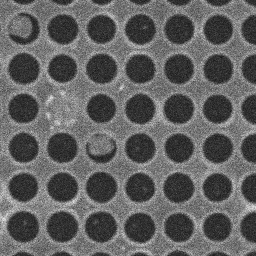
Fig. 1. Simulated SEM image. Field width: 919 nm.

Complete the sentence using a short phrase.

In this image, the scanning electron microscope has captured a regular array of holes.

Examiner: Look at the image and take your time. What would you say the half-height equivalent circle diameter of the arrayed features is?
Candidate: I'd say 0.111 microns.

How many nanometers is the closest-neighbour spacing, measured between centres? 139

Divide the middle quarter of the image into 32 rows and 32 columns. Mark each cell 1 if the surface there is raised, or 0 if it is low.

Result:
00011000000001100000000110000000
00011000000001100000000110000000
00011100000001110000000110000000
00011100000001110000001110000000
01111110000011111000011111000001
11111111111111111111111111111111
11111111111111111111111111111111
11111111001111111100111111100111
11111110000011110000001111000001
11111100000001110000001110000000
11111100000001100000000110000000
11111000000001100000000110000000
11111100000001100000000110000000
11111100000011110000001110000000
11111110000111111000011111000001
11111111111111111111111111111111
11111111111111111111111111111111
01111111001111111100111111110011
00011100011011110000001111000001
00011101111001100000000110000000
00001001111101100000000110000000
00001001110001100000000110000000
00011100000001110000000110000000
00011100000011110000001111000000
01111111000111111100011111100011
11111111111111111111111111111111
11111111111111111111111111111111
00111110000011111000011111100001
00011100000001110000001110000000
00011100000001110000000110000000
00001000000000100000000110000000
00001000000001100000000110000000